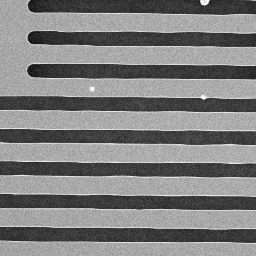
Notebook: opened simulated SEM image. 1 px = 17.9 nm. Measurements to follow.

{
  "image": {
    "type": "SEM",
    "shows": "groups of lines, slits or small figures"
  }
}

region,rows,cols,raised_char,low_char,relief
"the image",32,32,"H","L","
HHHHLLLLLLLLLLLLLLLLLLLLLHLLLLLL
HHHHLLLLLLLLLLLLLLLLLLLLLLLLLLLL
HHHHHHHHHHHHHHHHHHHHHHHHHHHHHHHH
HHHHHHHHHHHHHHHHHHHHHHHHHHHHHHHH
HHHHLLLLLLLLLLLLLLLLLLLLLLLLLLLL
HHHHLLLLLLLLLLLLLLLLLLLLLLLLLLLL
HHHHHHHHHHHHHHHHHHHHHHHHHHHHHHHH
HHHHHHHHHHHHHHHHHHHHHHHHHHHHHHHH
HHHHLLLLLLLLLLLLLLLLLLLLLLLLLLLL
HHHHLLLLLLLLLLLLLLLLLLLLLLLLLLLL
HHHHHHHHHHHHHHHHHHHHHHHHHHHHHHHH
HHHHHHHHHHHHHHHHHHHHHHHHHHHHHHHH
LLLLLLLLLLLLLLLLLLLLLLLLLLLLLLLL
LLLLLLLLLLLLLLLLLLLLLLLLLLLLLLLL
HHHHHHHHHHHHHHHHHHHHHHHHHHHHHHHH
HHHHHHHHHHHHHHHHHHHHHHHHHHHHHHHH
LLLLLLLLLLLLLLLLLLLLLLLLLLLLLLLL
LLLLLLLLLLLLLLLLLLLLLLLLLLLLLLLL
HHHHHHHHHHHHHHHHHHHHHHHHHHHHHHHH
HHHHHHHHHHHHHHHHHHHHHHHHHHHHHHHH
LLLLLLLLLLLLLLLLLLLLLLLLLLLLLLLL
LLLLLLLLLLLLLLLLLLLLLLLLLLLLLLLL
HHHHHHHHHHHHHHHHHHHHHHHHHHHHHHHH
HHHHHHHHHHHHHHHHHHHHHHHHHHHHHHHH
LLLLLLLLLLLLLLLLLLLLLLLLLLLLLLLL
LLLLLLLLLLLLLLLLLLLLLLLLLLLLLLLL
HHHHHHHHHHHHHHHHHHHHHHHHHHHHHHHH
HHHHHHHHHHHHHHHHHHHHHHHHHHHHHHHH
LLLLLLLLLLLLLLLLLLLHHHHHHHHHHHHH
LLLLLLLLLLLLLLLLLLLLLLLLLLLLLLLL
HHHHHHHHHHHHHHHHHHHHHHHHHHHHHHHH
HHHHHHHHHHHHHHHHHHHHHHHHHHHHHHHH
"